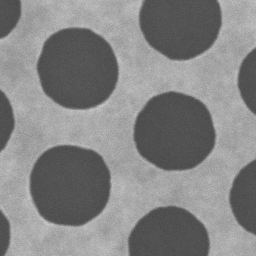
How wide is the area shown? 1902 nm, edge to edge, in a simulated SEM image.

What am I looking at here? holes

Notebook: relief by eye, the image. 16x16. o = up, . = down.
.oooooooo.....oo
.oooooooo.....oo
ooo....oo....ooo
oo.....ooo..ooo.
oo.....oooooooo.
ooo....oooooooo.
.ooo..ooo....oo.
.ooooooo.....ooo
.ooooooo.....ooo
ooo...ooo....ooo
oo.....ooo..ooo.
oo.....oooooooo.
oo.....ooooooo..
ooo...ooo...ooo.
.ooooooo.....ooo
.ooooooo.....ooo